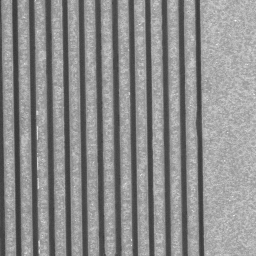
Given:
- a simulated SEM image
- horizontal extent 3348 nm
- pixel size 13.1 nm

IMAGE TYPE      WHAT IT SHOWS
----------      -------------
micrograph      parallel lines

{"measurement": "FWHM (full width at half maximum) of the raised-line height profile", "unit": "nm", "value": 142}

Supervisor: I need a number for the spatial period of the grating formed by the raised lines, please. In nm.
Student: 217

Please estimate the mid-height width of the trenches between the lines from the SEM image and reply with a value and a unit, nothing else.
5.87 px